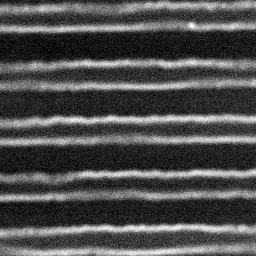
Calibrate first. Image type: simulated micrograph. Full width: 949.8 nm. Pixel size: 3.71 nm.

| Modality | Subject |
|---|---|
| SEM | lines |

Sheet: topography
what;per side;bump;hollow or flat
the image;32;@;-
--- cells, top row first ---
-------------------------------@
@@@@@@@@@@@@@@@@@@@@@@@@@@@@@@@@
@@@@@@@@@@@@@@@@@@@@@@@@@@@@@@@@
@@@@@@@@@@@@@-@@----------------
--------------------------------
--------------------------------
--------------------------------
--------------------------------
@@@@@@@@@@@@@@@@@@@@@@@@@@@@@@@@
@@@@@@@@@@@@@@@@@@@@@@@@@@@@@@@@
@@@@@@@@@@@@@@@@@@@@@@@@@@------
--------------------------------
--------------------------------
--------------------------------
--------------------------------
@@@@@@@@@@@@@@@@@@@@@@@@@@@@@@@@
@@@@@@@@@@@@@@@@@@@@@@@@@@@@@@@@
@@@@@@@@@@@@@@---@@@@@@@@@@@@@@@
--------------------------------
--------------------------------
--------------------------------
------------------------@------@
@@@@@@@@@@@@@@@@@@@@@@@@@@@@@@@@
@@@@@@@@@@@@@@@@@@@@@@@@@@@@@@@@
@@@@@@@@@---------@@@@@---------
--------------------------------
--------------------------------
--------------------------------
------------@@--@@@-@@@@@@------
@@@@@@@@@@@@@@@@@@@@@@@@@@@@@@@@
@@@@@@@@@@@@@@@@@@@@@@@@@@@@@@@@
-@@@@@@@@@@-@@@@@@@@@@----------